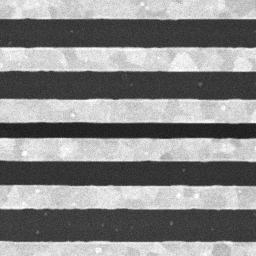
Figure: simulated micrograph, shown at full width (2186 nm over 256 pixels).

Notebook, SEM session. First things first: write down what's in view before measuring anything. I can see lines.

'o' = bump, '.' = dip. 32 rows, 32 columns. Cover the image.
oooooooooooooooooooooooooooooooo
oooooooooooooooooooooooooooooooo
................................
................................
................................
................................
oooooooooooooooooooooooooooooooo
oooooooooooooooooooooooooooooooo
oooooooooooooooooooooooooooooooo
................................
................................
................................
oooo.......oo..oo....o..........
oooooooooooooooooooooooooooooooo
oooooooooooooooooooooooooooooooo
................................
................................
oooooooooooooooooooooooooooooooo
oooooooooooooooooooooooooooooooo
oooooooooooooooooooooooooooooooo
................................
................................
................................
oooooooooooooooooooooooooooooooo
oooooooooooooooooooooooooooooooo
oooooooooooooooooooooooooooooooo
................................
................................
................................
................................
oooooooooooooooooooooooooooooooo
oooooooooooooooooooooooooooooooo